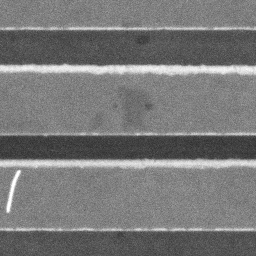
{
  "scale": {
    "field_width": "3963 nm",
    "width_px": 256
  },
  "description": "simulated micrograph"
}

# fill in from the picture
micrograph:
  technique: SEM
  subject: lines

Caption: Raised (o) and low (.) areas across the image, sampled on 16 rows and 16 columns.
oooooooooooooooo
oooooooooooooooo
................
................
oooooooooooooooo
oooooooooooooooo
oooooooooooooooo
oooooooooooooooo
................
................
oooooooooooooooo
oooooooooooooooo
oooooooooooooooo
oooooooooooooooo
................
................